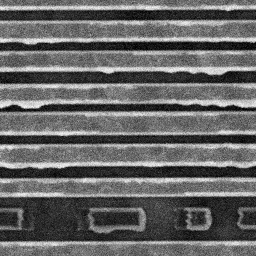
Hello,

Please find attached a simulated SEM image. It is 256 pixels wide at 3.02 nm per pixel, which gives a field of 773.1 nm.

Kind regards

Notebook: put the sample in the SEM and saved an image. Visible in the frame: parallel lines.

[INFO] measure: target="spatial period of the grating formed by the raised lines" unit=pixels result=31.2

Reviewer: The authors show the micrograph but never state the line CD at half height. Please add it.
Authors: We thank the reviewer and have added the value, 61.5 nm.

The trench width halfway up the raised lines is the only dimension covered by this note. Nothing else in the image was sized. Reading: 35.1 nm